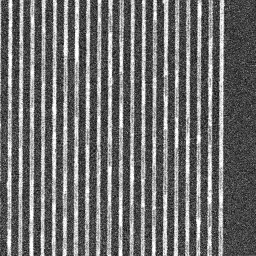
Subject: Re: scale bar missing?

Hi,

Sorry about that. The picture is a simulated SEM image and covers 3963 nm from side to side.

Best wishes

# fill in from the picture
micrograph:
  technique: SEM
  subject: parallel lines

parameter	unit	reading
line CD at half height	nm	40.6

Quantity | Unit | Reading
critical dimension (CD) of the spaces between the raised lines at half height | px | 8.88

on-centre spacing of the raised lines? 172 nm